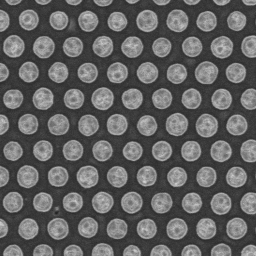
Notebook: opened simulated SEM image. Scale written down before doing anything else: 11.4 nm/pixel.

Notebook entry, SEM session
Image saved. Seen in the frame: a regular array of raised bodies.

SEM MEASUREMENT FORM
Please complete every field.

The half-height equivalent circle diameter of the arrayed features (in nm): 221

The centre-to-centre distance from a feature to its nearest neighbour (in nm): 334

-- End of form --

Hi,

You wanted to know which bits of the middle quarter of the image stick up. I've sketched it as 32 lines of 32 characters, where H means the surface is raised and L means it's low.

LLLLHHHHLLLLHHHLLLLHHHHLLLLHHHLL
HLLLHHHHLLLHHHHHLLLHHHHLLLHHHHLL
HLLLHHHHLLLHHHHHLLLHHHHLLLHHHHLL
HLLLHHHHLLLHHHHLLLLHHHHLLLHHHHLL
LLLLLLLLLLLLLHLLLLLLHHLLLLLHHLLL
LLLLLLLLLLLLLLLLLLLLLLLLLLLLLLLL
LLHHLLLLHHHLLLLLHHHLLLLLHHLLLLLH
LHHHHLLHHHHHLLLHHHHLLLLHHHHLLLHH
HHHHHLLHHHHHLLLHHHHLLLHHHHHLLLHH
HHHHHLLHHHHHLLLHHLHLLLHHHHHLLLHH
LHHHLLLLHHHLLLLHHHHLLLLHHHLLLLHH
LLLLLLLLLLLLLLLLLLLLLLLLLLLLLLLL
LLLLLLLLLLLLLLLLLLLLLLLLLLLLHLLL
LLLLHHHHLLLHHHHLLLLHHHLLLLHHHHLL
HLLLHHHHLLLHHHHHLLLHHHHLLLHHHHHL
HLLLHHHHHLLHHHHHLLLHHHHLLLHHHHHL
HLLLHHHHLLLHHHHLLLLHHHHLLLHHHHLL
LLLLLHHLLLLLHHLLLLLHHHLLLLLHHHLL
LLLLLLLLLLLLLLLLLLLLLLLLLLLLLLLL
LHHLLLLLLHLLLLLLLLLLLLLLLLLLLLLL
HHHHLLLHHHHHLLLHHHHLLLHHHHLLLLHH
HHHHHLLHHHHHLLLHHHHLLLHHHHHLLLHH
HHHHHLLHHHHHLLLHHHHLLLHHHHLLLLHH
LHHHLLLLHHHLLLLLHHHLLLLHHHLLLLHH
LLLLLLLLLLLLLLLLLLLLLLLLLLLLLLLL
LLLLLLLLLLLLLLLLLLLLLLLLLLLLLLLL
LLLLHHHHLLLHHHHLLLLHHHLLLLLHHHLL
HLLHHHHHLLLHHLHHLLHHHHHLLLHHHHLL
HLLHHHHHLLLHHHHHLLHHHHHLLLHHHHLL
LLLLHHHHLLLHHHHLLLLHHHHLLLHHHHLL
LLLLLHHLLLLLLHLLLLLLLLLLLLLLLLLL
LLLLLLLLLLLLLLLLLLLLLLLLLLLLLLLL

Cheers